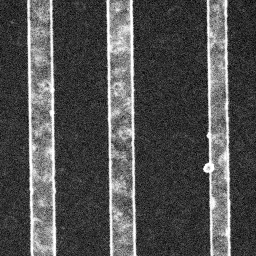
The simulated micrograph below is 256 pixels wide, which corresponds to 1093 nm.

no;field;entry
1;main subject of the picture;one or a few lines or trenches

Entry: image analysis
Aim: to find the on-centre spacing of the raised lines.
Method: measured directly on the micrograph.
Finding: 378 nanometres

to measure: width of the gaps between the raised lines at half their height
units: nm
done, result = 274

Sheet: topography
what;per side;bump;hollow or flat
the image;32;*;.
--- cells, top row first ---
....**.......***..........**....
....**.......***..........**....
....**........**..........**....
....**........**..........**....
....**........**..........**....
....**........**..........**....
....**........***.........**....
....**........***.........**....
....***.......***.........**....
....***.......**..........**....
....**........***.........**....
....***........**.........**....
....***.......***.........**....
....***.......***.........**....
....***.......***.........**....
....***.......***.........**....
....***.......*.*.........**....
....***.......***.........**....
....***.......***.........**....
....***.......***.........***...
....***.......***.........**....
....***.......***.........***...
....***.......***.........***...
....***.......***.........***...
....***.......***.........***...
....***.......***.........***...
....***.......***.........***...
....***.......***.........***...
....***.......***.........***...
....***.......***.........***...
....***.......***.........***...
....***.......***.........***...